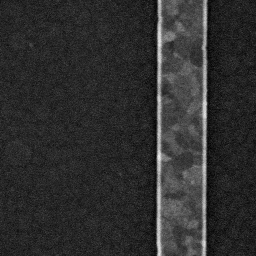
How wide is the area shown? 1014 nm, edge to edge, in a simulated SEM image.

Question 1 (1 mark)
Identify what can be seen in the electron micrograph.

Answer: one or a few lines or trenches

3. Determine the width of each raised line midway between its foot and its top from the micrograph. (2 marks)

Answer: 181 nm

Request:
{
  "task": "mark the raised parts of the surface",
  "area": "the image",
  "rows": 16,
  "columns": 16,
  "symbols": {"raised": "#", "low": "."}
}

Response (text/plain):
..........###...
..........###...
..........###...
..........###...
..........###...
..........###...
..........###...
..........###...
..........###...
..........###...
..........###...
..........###...
..........###...
..........###...
..........###...
..........###...